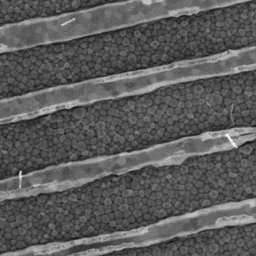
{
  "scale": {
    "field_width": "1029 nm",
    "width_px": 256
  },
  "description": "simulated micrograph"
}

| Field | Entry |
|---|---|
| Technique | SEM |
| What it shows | one or a few lines or trenches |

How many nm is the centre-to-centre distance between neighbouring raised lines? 298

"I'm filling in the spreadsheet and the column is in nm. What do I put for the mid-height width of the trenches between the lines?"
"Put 226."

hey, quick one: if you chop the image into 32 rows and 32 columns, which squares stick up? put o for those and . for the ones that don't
...............oooooooooooooo...
..........ooooooooooooooo.......
.....oooooooooooooo.............
oooooooooooooo..................
oooooooooo......................
ooooo...........................
............................oooo
.........................ooooooo
...................ooooooooooooo
..............ooooooooooooo.....
..........oooooooooo............
.....oooooooooooo...............
ooooooooooooo...................
ooooooooo.......................
ooooo...........................
................................
..........................oooooo
......................oooooooooo
...................ooooooooo....
..............ooooooooo.........
.........ooooooooo..............
.....ooooooooooo................
.oooooooooo.....................
oooooo..........................
o...............................
..............................oo
.........................ooooooo
.....................ooooooooooo
.................ooooooooo......
.............ooooooooo..........
........oooooooooo..............
...oooooooooo...................